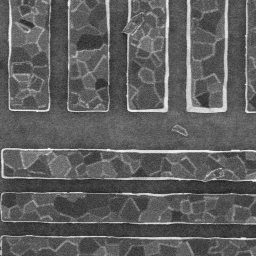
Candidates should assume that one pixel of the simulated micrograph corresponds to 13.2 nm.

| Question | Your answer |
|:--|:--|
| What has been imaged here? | groups of lines, slits or small figures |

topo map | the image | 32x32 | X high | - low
-XXXXX---XXXX---XXXXX---XXXX---X
-XXXXX---XXXX---XXXXX---XXXX---X
-XXXXX---XXXXX--XXXXX---XXXX---X
-XXXXX---XXXXX--XXXXX---XXXX---X
-XXXXX---XXXXX--XXXXX---XXXX---X
-XXXXX---XXXXX--XXXXX---XXXX---X
-XXXXX---XXXXX--XXXXX---XXXX---X
-XXXXX---XXXXX--XXXXX---XXXX---X
-XXXXX---XXXXX--XXXXX---XXXX---X
-XXXXX---XXXXX--XXXXX---XXXX---X
-XXXXX---XXXXX--XXXXX---XXXX---X
-XXXXX---XXXXX--XXXXX---XXXX---X
-XXXXX---XXXXX--XXXXX---XXXX---X
-XXXXX---XXXXX--XXXXX---XXXX---X
--------------------------------
--------------------------------
--------------------------------
--------------------------------
--------------------------------
XXXXXXXXXXXXXXXXXXXXXXXXXXXXXXXX
XXXXXXXXXXXXXXXXXXXXXXXXXXXXXXXX
XXXXXXXXXXXXXXXXXXXXXXXXXXXXXXXX
------------------------XXX-XXXX
--------------------------------
XXXXXXXXXXXXXXXXXXXXXXXXXXXXXXXX
XXXXXXXXXXXXXXXXXXXXXXXXXXXXXXXX
XXXXXXXXXXXXXXXXXXXXXXXXXXXXXXXX
XXXXXXXXXXXXXXXXXXXXXXXXXXXXXXXX
--------------------------------
--------------------------------
XXXXXXXXXXXXXXXXXXXXXXXXXXXXXXXX
XXXXXXXXXXXXXXXXXXXXXXXXXXXXXXXX